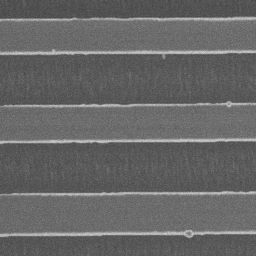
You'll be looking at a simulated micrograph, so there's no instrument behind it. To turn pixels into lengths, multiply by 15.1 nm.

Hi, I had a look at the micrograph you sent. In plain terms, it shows lines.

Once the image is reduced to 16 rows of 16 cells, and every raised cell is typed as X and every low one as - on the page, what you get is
----------------
XXXXXXXXXXXXXXXX
XXXXXXXXXXXXXXXX
----------------
----------------
----------------
------------XXXX
XXXXXXXXXXXXXXXX
XXXXXXXXXXXXXXXX
----------------
----------------
----------------
XXXXXXXXXXXXXXXX
XXXXXXXXXXXXXXXX
XXXXXXXXXXXXXXXX
----------------